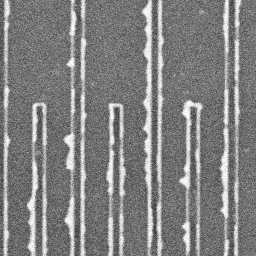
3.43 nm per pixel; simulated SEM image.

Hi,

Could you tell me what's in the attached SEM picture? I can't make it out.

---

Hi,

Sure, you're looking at parallel lines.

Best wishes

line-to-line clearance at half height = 0.0866 um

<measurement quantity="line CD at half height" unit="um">0.0463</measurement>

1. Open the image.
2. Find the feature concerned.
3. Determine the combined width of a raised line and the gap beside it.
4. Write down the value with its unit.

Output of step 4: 132 nm